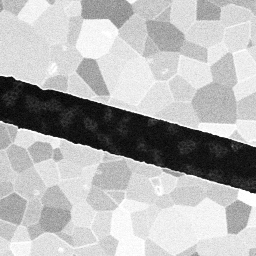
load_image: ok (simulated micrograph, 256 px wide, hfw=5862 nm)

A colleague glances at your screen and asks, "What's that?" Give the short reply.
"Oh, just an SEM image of one or a few lines or trenches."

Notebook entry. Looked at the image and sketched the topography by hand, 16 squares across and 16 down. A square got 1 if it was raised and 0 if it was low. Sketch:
1111111111111111
1111111111111111
1111111111111111
1111111111111111
1111111111111111
0001111111111111
0000000111111111
0000000000111111
1110000000000011
1111111000000000
1111111111000000
1111111111111100
1111111111111111
1111111111111111
1111111111111111
1111111111111111